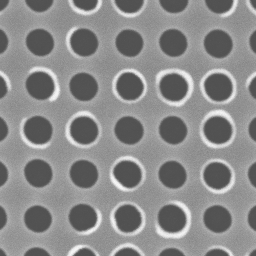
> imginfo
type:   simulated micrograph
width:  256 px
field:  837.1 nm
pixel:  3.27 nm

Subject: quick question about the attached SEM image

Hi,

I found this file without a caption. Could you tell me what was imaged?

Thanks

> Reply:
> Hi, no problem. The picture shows a regular array of holes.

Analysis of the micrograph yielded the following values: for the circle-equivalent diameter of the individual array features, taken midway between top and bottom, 91.6 nm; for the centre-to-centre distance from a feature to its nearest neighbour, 142 nm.